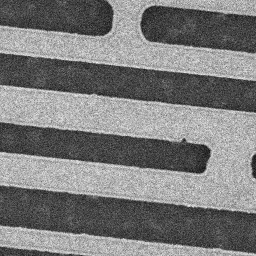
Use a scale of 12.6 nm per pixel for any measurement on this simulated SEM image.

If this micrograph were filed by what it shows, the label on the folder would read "one or a few lines or trenches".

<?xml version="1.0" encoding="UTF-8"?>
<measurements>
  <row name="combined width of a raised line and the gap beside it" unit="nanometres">816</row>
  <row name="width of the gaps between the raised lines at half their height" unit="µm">0.431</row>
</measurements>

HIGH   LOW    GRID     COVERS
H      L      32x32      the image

LLLLLLLLLLLLLLHHHHHHHHHHHHHHHHHH
LLLLLLLLLLLLLLHHHHLLLLLLLLLLHHHH
LLLLLLLLLLLLLLHHHHLLLLLLLLLLLLLL
HLLLLLLLLLLLLLHHHLLLLLLLLLLLLLLL
HHHHHHHHHHLLLHHHHHLLLLLLLLLLLLLL
HHHHHHHHHHHHHHHHHHHHLLLLLLLLLLLL
LHHHHHHHHHHHHHHHHHHHHHHHHHHHHLLL
LLLLLLLLLLHHHHHHHHHHHHHHHHHHHHHH
LLLLLLLLLLLLLLLLLLLHHHHHHHHHHHHH
LLLLLLLLLLLLLLLLLLLLLLLLLLLLHHHH
LLLLLLLLLLLLLLLLLLLLLLLLLLLLLLLL
HHHHHHHLLLLLLLLLLLLLLLLLLLLLLLLL
HHHHHHHHHHHHHHHHLLLLLLLLLLLLLLLL
HHHHHHHHHHHHHHHHHHHHHHHHHLLLLLLL
HHHHHHHHHHHHHHHHHHHHHHHHHHHHHHHH
LLLHHHHHHHHHHHHHHHHHHHHHHHHHHHHH
LLLLLLLLLLLLHHHHHHHHHHHHHHHHHHHH
LLLLLLLLLLLLLLLLLLLLLLHHHHHHHHHH
LLLLLLLLLLLLLLLLLLLLLLLLLLHHHHHH
HHHLLLLLLLLLLLLLLLLLLLLLLLHHHHHH
HHHHHHHHHHHHHLLLLLLLLLLLLLHHHHHL
HHHHHHHHHHHHHHHHHHHHHHLLLLHHHHHL
HHHHHHHHHHHHHHHHHHHHHHHHHHHHHHHH
LLLLLHHHHHHHHHHHHHHHHHHHHHHHHHHH
LLLLLLLLLLLLLLHHHHHHHHHHHHHHHHHH
LLLLLLLLLLLLLLLLLLLLLLLHHHHHHHHH
LLLLLLLLLLLLLLLLLLLLLLLLLLLLLLLL
LLLLLLLLLLLLLLLLLLLLLLLLLLLLLLLL
HLLLLLLLLLLLLLLLLLLLLLLLLLLLLLLL
HHHHHHHHHHHLLLLLLLLLLLLLLLLLLLLL
HHHHHHHHHHHHHHHHHHHLLLLLLLLLLLLL
LLLLLLLLHHHHHHHHHHHHHHHHHHHHHLLL